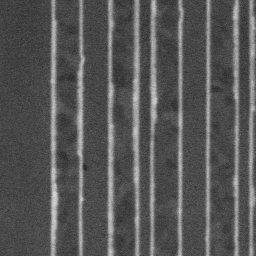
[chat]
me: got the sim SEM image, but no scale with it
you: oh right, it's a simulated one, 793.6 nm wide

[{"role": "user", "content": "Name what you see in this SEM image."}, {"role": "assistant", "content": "parallel lines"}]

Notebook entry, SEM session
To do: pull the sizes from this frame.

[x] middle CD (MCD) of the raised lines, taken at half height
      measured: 87.9 nanometers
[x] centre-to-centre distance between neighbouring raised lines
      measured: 161 nm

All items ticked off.